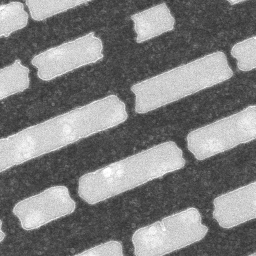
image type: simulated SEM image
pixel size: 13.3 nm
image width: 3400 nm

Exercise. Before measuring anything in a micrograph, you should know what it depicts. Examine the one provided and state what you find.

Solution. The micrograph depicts one or a few lines or trenches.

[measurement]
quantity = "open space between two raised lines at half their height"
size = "372 nm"